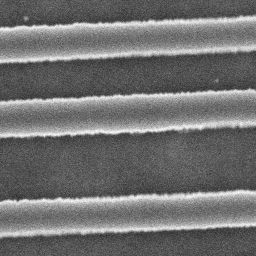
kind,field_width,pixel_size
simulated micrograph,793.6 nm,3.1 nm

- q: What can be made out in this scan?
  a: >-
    lines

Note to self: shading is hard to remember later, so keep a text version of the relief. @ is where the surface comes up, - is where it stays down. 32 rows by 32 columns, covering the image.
--------------------------------
--------------------------------
--------------------------@@@@@@
@@@@@@@@@@@@@@@@@@@@@@@@@@@@@@@@
@@@@@@@@@@@@@@@@@@@@@@@@@@@@@@@@
@@@@@@@@@@@@@@@@@@@@@@@@@@@@@@@@
@@@@@@@@@@@@@@@@@@@@@@@@@-------
@@@@@---------------------------
--------------------------------
--------------------------------
--------------------------------
--------------------------@@@@@@
----@-@@@@@@@@@@@@@@@@@@@@@@@@@@
@@@@@@@@@@@@@@@@@@@@@@@@@@@@@@@@
@@@@@@@@@@@@@@@@@@@@@@@@@@@@@@@@
@@@@@@@@@@@@@@@@@@@@@@@@@@@@@@@@
@@@@@@@@@@@@@@@@@---------------
--------------------------------
--------------------------------
--------------------------------
--------------------------------
--------------------------------
--------------------------------
--------------------------------
----------------------@@@@@@@@@@
@@@@@@@@@@@@@@@@@@@@@@@@@@@@@@@@
@@@@@@@@@@@@@@@@@@@@@@@@@@@@@@@@
@@@@@@@@@@@@@@@@@@@@@@@@@@@@@@@@
@@@@@@@@@@@@@@@@@@@@@@@@@@------
--------------------------------
--------------------------------
--------------------------------